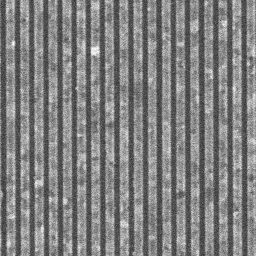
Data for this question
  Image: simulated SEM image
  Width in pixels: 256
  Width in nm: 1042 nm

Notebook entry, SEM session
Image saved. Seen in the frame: parallel lines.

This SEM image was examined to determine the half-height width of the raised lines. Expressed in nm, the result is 30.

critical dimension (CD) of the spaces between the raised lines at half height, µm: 0.03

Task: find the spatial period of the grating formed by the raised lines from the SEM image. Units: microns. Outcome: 0.0576